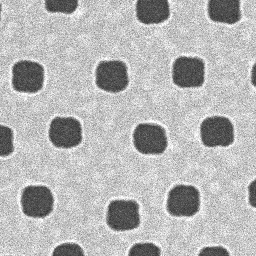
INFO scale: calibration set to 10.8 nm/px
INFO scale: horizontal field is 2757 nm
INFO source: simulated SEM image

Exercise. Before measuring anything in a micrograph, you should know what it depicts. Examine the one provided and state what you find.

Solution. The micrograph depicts a regular array of holes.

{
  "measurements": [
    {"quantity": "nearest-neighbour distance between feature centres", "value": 723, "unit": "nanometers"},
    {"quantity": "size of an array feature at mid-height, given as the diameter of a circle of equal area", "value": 0.369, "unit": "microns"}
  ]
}